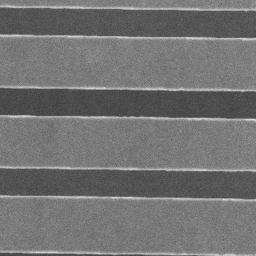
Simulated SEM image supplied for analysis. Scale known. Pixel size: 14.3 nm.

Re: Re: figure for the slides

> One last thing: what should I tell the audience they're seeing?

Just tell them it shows lines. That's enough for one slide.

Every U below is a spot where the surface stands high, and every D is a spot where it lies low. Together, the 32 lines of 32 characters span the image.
UUUUUUUUUUUUUUUUUUUUUUUUUUUUUUUU
DDDDDDDDDDDDDDDDDDDDDDDDDDDDDDDD
DDDDDDDDDDDDDDDDDDDDDDDDDDDDDDDD
DDDDDDDDDDDDDDDDDDDDDDDDDDDDDDDD
UUUDDDDDDDDDDDDDDDDDDDDDDDDDDDDD
UUUUUUUUUUUUUUUUUUUUUUUUUUUUUUUU
UUUUUUUUUUUUUUUUUUUUUUUUUUUUUUUU
UUUUUUUUUUUUUUUUUUUUUUUUUUUUUUUU
UUUUUUUUUUUUUUUUUUUUUUUUUUUUUUUU
UUUUUUUUUUUUUUUUUUUUUUUUUUUUUUUU
UUUUUUUUUUUUUUUUUUUUUUUUUUUUUUUU
DDDDDDDDDDDDDDDDDDDDDDDDDDDDDDDD
DDDDDDDDDDDDDDDDDDDDDDDDDDDDDDDD
DDDDDDDDDDDDDDDDDDDDDDDDDDDDDDDD
UUUUDDDDDDDDDDDDDDDDDDDDDDDDDDDD
UUUUUUUUUUUUUUUUUUUUUUUUUUUUUUUU
UUUUUUUUUUUUUUUUUUUUUUUUUUUUUUUU
UUUUUUUUUUUUUUUUUUUUUUUUUUUUUUUU
UUUUUUUUUUUUUUUUUUUUUUUUUUUUUUUU
UUUUUUUUUUUUUUUUUUUUUUUUUUUUUUUU
UUUUUUUUUUUUUUUUUUUUUUUUUUUUUUUU
DDDDDDDDDDDDDDDDDDDDDDDDDDDDDDDD
DDDDDDDDDDDDDDDDDDDDDDDDDDDDDDDD
DDDDDDDDDDDDDDDDDDDDDDDDDDDDDDDD
UDDDDDDDDDDDDDDDDDDDDDDDDDDDDDDD
UUUUUUUUUUUUUUUUUUUUUUUUUUUUUUUU
UUUUUUUUUUUUUUUUUUUUUUUUUUUUUUUU
UUUUUUUUUUUUUUUUUUUUUUUUUUUUUUUU
UUUUUUUUUUUUUUUUUUUUUUUUUUUUUUUU
UUUUUUUUUUUUUUUUUUUUUUUUUUUUUUUU
UUUUUUUUUUUUUUUUUUUUUUUUUUUUUUUU
DDDUUUUUUUUUUUUUUUUUUUUUUUUUUUUU